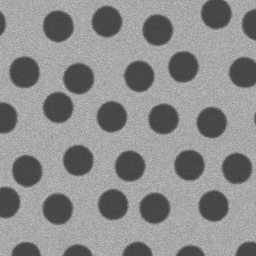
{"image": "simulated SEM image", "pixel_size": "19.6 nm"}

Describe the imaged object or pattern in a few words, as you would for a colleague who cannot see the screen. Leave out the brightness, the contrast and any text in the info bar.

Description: a regular array of holes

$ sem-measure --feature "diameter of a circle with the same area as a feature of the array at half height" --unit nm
616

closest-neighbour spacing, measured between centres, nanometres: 905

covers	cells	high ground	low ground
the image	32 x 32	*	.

*************************....***
******..****...**********....**.
.****....**....***...****....*..
.****....***...***....****..**..
******...****.****...**********.
*******************..***********
**********************..********
**..*****************....****...
*....***...*****...**....****...
*....***....****...**...*****...
**..****....****...**********...
*******.*..******.**************
******...***********************
..***....***....***...****.*****
..****...***....***...***...****
..**********....***...***...****
.************..****..****...****
********************************
*********..*********************
***.****....***...****...***...*
**...***....**....****....**...*
**...***...***....****...***...*
**...**********..******.****...*
..******************************
..****..*****...**...****...****
..***....***....*....****....***
..***....***....*....****....***
******...*********...*****..****
********************************
********************************
**..************..************..
*....***...****....***...****...